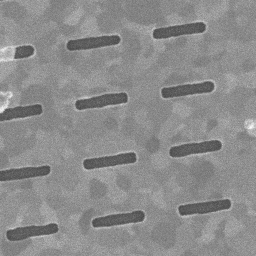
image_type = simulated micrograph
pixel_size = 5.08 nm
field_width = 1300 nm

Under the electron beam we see a regular array of holes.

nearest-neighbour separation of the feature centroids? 0.301 µm